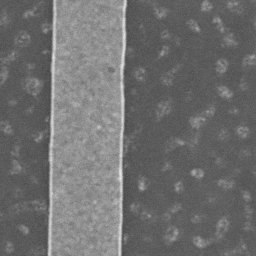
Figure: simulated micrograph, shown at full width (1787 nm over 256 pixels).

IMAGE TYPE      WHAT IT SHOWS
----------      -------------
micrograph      one or a few lines or trenches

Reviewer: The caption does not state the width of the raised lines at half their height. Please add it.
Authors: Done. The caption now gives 489 nanometres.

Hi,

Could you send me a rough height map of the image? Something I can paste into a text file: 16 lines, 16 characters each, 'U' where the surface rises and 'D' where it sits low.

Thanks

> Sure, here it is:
DDDUUUUUDDDDDDDD
DDDUUUUUDDDDDDDD
DDDUUUUUDDDDDDDD
DDDUUUUUDDDDDDDD
DDDUUUUUDDDDDDDD
DDDUUUUUDDDDDDDD
DDDUUUUUDDDDDDDD
DDDUUUUUDDDDDDDD
DDDUUUUUDDDDDDDD
DDDUUUUUDDDDDDDD
DDDUUUUUDDDDDDDD
DDDUUUUUDDDDDDDD
DDDUUUUUDDDDDDDD
DDDUUUUUDDDDDDDD
DDDUUUUUDDDDDDDD
DDDUUUUDDDDDDDDD